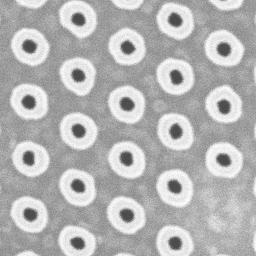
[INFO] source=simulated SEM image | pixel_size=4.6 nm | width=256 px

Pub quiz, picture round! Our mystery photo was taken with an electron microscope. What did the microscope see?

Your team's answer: a regular array of ring-shaped raised bodies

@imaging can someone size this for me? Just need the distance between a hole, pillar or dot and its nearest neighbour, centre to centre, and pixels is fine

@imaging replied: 55.1